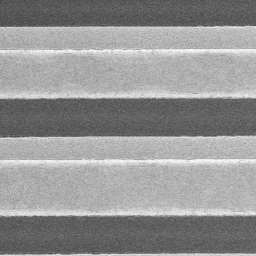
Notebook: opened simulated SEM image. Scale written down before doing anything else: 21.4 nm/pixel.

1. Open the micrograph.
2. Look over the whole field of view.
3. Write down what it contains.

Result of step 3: lines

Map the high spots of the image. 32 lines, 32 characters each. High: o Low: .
................................
................................
................................
oooooooooooooooooooooooooooooooo
oooooooooooooooooooooooooooooooo
oooooooooooooooooooooooooooooooo
oooooooooooooooooooooooooooooooo
oooooooooooooooooooooooooooooooo
oooooooooooooooooooooooooooooooo
oooooooooooooooooooooooooooooooo
oooooooooooooooooooooooooooooooo
oooooooooooooooooooooooooooooooo
................................
................................
................................
................................
................................
oooooooooooooooooooooooooooooooo
oooooooooooooooooooooooooooooooo
oooooooooooooooooooooooooooooooo
oooooooooooooooooooooooooooooooo
oooooooooooooooooooooooooooooooo
oooooooooooooooooooooooooooooooo
oooooooooooooooooooooooooooooooo
oooooooooooooooooooooooooooooooo
oooooooooooooooooooooooooooooooo
oooooooooooooooooooooooooooooooo
................................
................................
................................
................................
................................